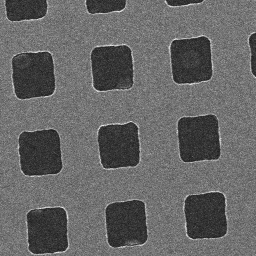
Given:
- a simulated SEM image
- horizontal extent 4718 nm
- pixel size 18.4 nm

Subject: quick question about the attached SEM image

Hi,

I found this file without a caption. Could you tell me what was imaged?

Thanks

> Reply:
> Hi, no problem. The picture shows a regular array of holes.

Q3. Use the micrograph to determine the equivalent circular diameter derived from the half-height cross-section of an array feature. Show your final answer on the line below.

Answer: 834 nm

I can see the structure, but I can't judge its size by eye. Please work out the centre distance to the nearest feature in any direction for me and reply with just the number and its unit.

1420 nanometres